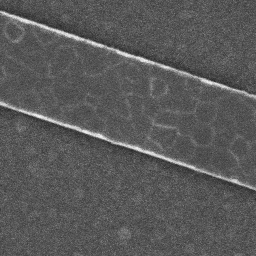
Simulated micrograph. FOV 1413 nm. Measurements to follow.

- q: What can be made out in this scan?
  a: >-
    one or a few lines or trenches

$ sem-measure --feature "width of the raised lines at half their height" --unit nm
491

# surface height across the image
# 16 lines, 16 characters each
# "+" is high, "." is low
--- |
................
++..............
+++++...........
++++++++........
+++++++++++.....
++++++++++++++..
++++++++++++++++
...+++++++++++++
......++++++++++
.........+++++++
............++++
...............+
................
................
................
................